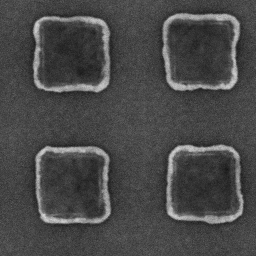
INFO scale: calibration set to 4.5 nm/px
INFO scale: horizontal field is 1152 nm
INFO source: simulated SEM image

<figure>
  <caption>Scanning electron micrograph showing raised bodies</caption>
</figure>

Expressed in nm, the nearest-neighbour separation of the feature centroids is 586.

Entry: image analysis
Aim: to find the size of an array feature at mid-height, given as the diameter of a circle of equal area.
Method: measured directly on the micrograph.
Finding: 358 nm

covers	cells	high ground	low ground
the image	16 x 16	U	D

DDDDDDDDDDDDDDDD
DDUUUUDDDDUUUUUD
DDUUUUUDDDUUUUUD
DDUUUUUDDDUUUUUD
DDUUUUUDDDUUUUUD
DDDUUUDDDDDDDDDD
DDDDDDDDDDDDDDDD
DDDDDDDDDDDDDDDD
DDDDDDDDDDDDDDDD
DDDUUUDDDDDUUUUD
DDUUUUUDDDDUUUUD
DDUUUUUDDDDUUUUD
DDUUUUUDDDDUUUUD
DDDUUUUDDDDUUUUD
DDDDDDDDDDDDDDDD
DDDDDDDDDDDDDDDD